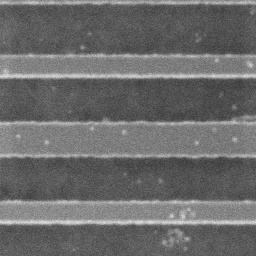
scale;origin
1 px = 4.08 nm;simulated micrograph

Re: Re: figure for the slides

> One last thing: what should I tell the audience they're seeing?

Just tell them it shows lines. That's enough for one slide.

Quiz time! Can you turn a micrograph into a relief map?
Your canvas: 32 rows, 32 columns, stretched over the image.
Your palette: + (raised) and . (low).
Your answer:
................................
................................
................................
................................
................................
................................
................................
++++++++++++++++++++++++++++++++
++++++++++++++++++++++++++++++++
++++++++++++++++++++++++++++++++
................................
................................
................................
................................
................................
++++++++++++++++++++++++++++++++
++++++++++++++++++++++++++++++++
++++++++++++++++++++++++++++++++
++++++++++++++++++++++++++++++++
++++++++++++++++++++++++++++++++
................................
................................
................................
................................
................................
++++++++++++++++++++++++++++++++
++++++++++++++++++++++++++++++++
++++++++++++++++++++++++++++++++
................................
................................
................................
................................